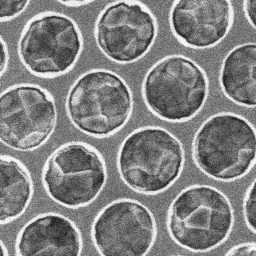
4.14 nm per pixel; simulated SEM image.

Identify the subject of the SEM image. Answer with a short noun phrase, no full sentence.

holes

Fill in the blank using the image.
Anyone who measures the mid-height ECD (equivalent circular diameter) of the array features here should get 237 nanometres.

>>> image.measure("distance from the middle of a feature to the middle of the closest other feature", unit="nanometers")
309